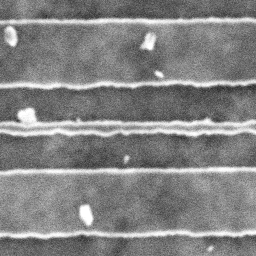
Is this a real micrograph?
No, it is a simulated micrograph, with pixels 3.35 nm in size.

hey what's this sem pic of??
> lines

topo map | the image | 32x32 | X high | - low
--------------------------------
--------------------------------
------------XXXXXXX---X-XXXXXXXX
XXXXXXXXXXXXXXXXXXXXXXXXXXXXXXXX
XXXXXXXXXXXXXXXXXXXXXXXXXXXXXXXX
XXXXXXXXXXXXXXXXXXXXXXXXXXXXXXXX
XXXXXXXXXXXXXXXXXXXXXXXXXXXXXXXX
XXXXXXXXXXXXXXXXXXXXXXXXXXXXXXXX
XXXXXXXXXXXXXXXXXXXXXXXXXXXXXXXX
XXXXXXXXXXXXXXXXXXXXXXXXXXXXXXXX
XXXXXXXXXXXXXXXXXX-XX---XXX-XXX-
--------------------------------
--------------------------------
--------------------------------
---X----------------------------
XXXXXXXXXXXXXXXXXXXXXXXXXXXXXXXX
XXXXXXXXXXXXXXXXXXX-XXXXXXXXXX--
--------------------------------
--------------------------------
--------------------------------
--------------------------------
-XXXXXXXXXXXXXXXXXXXXXXXXXXXXXXX
XXXXXXXXXXXXXXXXXXXXXXXXXXXXXXXX
XXXXXXXXXXXXXXXXXXXXXXXXXXXXXXXX
XXXXXXXXXXXXXXXXXXXXXXXXXXXXXXXX
XXXXXXXXXXXXXXXXXXXXXXXXXXXXXXXX
XXXXXXXXXXXXXXXXXXXXXXXXXXXXXXXX
XXXXXXXXXXXXXXXXXXXXXXXXXXXXXXXX
XXXXXXXXXXXXXXXXXXXXXXXXXXXXXXXX
-XX-XXX--------X----------------
--------------------------------
--------------------------------